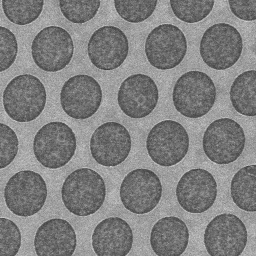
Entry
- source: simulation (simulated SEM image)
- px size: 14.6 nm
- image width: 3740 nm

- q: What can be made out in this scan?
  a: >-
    a regular array of holes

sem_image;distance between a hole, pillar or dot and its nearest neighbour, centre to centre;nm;805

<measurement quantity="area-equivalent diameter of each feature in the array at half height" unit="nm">650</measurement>